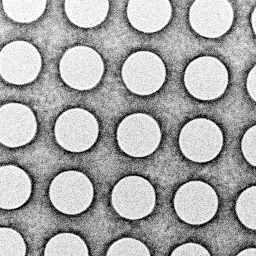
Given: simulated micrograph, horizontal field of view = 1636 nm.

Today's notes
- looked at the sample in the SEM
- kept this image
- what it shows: an array of small figures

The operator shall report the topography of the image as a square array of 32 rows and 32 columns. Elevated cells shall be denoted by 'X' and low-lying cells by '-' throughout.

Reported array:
XXXXXX--XXXXX---XXXXX---XXXXX---
-XXXX---XXXXX---XXXXX---XXXXX---
--XX-----XXXX---XXXXX---XXXXX---
-----------------XXX----XXXXX---
--------------------------X-----
-XXX----------------------------
XXXXX---XXXX--------------------
XXXXX---XXXXX---XXXX----XXX-----
XXXXX---XXXXX--XXXXXX--XXXXX----
XXXX----XXXXX--XXXXXX--XXXXX---X
--------XXXX----XXXX---XXXXX---X
-----------------XX-----XXXX---X
--------------------------------
XXX-----------------------------
XXXX----XXXX----XX--------------
XXXX---XXXXX---XXXXX---XXXX-----
XXXX---XXXXX---XXXXX---XXXXX---X
XXXX---XXXXX---XXXXX--XXXXXX--XX
--------XXX----XXXX----XXXXX--XX
-----------------X-----XXXX----X
--------------------------------
XXX-----XX----------------------
XXXX---XXXX----XXX--------------
XXXX--XXXXXX--XXXXX----XXX-----X
XXXX--XXXXXX--XXXXX---XXXXX---XX
XXX----XXXX---XXXXX---XXXXX---XX
--------XX-----XXXX---XXXXX---XX
-----------------------XXX----XX
-------------------------------X
XXX----XXX----------------------
XXX---XXXXX---XXXX--------------
XXX---XXXXX---XXXXX---XXXX----XX